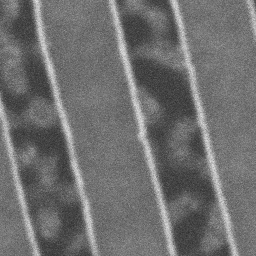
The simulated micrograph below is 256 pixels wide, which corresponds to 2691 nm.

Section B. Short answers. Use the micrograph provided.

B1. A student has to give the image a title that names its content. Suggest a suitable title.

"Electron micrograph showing one or a few lines or trenches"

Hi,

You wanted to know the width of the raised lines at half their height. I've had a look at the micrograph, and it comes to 632 nanometres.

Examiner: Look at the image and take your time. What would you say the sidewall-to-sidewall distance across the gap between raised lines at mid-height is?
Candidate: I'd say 784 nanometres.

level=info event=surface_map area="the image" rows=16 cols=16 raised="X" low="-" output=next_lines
XX-----XXXX-----
XX-----XXXX-----
XXX-----XXX-----
XXX-----XXXX----
XXX-----XXXX----
XXX-----XXXX----
XXXX----XXXX----
XXXX-----XXXX---
XXXX-----XXXX---
-XXXX----XXXX---
-XXXX----XXXX---
-XXXX-----XXXX--
-XXXX-----XXXX--
--XXX-----XXXX--
--XXXX-----XXX--
--XXXX-----XXXX-